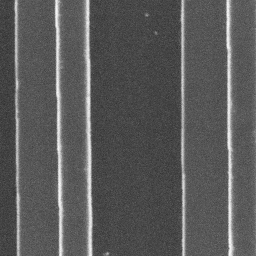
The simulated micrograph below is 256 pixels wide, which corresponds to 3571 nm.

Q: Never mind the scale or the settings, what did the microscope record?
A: lines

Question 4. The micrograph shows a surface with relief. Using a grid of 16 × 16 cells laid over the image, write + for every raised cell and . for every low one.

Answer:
.++++......+++++
.+++++.....+++++
.+++++.....+++++
.+++++.....+++++
.+++++.....+++++
.+++++.....+++++
.+++++.....+++++
.+++++.....+++++
.+++++.....+++++
.+++++.....+++++
.+++++.....+++++
.+++++.....+++++
.+++++......++++
.+++++......++++
.+++++......++++
.+++++......++++